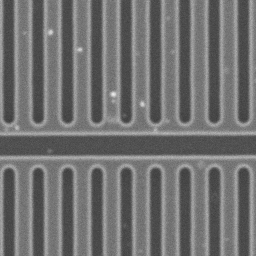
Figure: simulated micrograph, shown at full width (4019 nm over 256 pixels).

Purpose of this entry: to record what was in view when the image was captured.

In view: groups of lines, slits or small figures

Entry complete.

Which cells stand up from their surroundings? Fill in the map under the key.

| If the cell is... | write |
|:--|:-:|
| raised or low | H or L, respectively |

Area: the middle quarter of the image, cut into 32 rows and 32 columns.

LLLHHHLLLLHHHHLLLHHHHLLLLHHHHLLL
LLLHHHLLLLHHHHLLLHHHHLLLLHHHHLLL
LLLHHHLLLLHHHHLLLHHHHLLLLHHHHLLL
LLLHHHLLLLHHHHLLLHHHHLLLLHHHHLLL
LLLHHHLLLLHHHHLLLHHHHLLLLHHHHLLL
LLLHHHLLLLHHHHLLLHHHHLLLLHHHHLLL
LLLHHHLLLLHHHHLLLHHHHLLLLHHHHLLL
LLLHHHLLLLHHHHLLLHHHHLLLLHHHHLLL
LLLHHHLLLLHHHHLLLHHHHLLLLHHHHLLL
LLLHHHLLLLHHHHLLLHHHHLLLLHHHHLLL
LLLHHHLLLLHHHHLLLHHHHLLLLHHHHLLL
LLLHHHLLLLHHHHLLLHHHHLLLLHHHHLLL
LLLHHHLLLLHHHHLLLHHHHLLLLHHHHLLL
LLLHHHLLLLHHHHLLLHHHHLLLLHHHHLLL
LLHHHHHLLHHHHHLLLHHHHHLLHHHHHLLH
HHHHHHHHHHHHHHHHHHHHHHHHHHHHHHHH
HHHHHHHHHHHHHHHHHHHHHHHHHHHHHHHH
LLLLLLLLLLLLLLLLLLLLLLLLLLLLLLLL
LLLLLLLLLLLLLLLLLLLLLLLLLLLLLLLL
LLLLLLLLLLLLLLLLLLLLLLLLLLLLLLLL
LLLLLLLLLLLLLLLLLLLLLLLLLLLLLLLL
LLLLLLLLLLLLLLLLLLLLLLLLLLLLLLLL
LLLLLLLLLLLLLLLLLLLLLLLLLLLLLLLL
HHHHHHHHHHHHHHHHHHHHHHHHHHHHHHHH
HHHHHHHHHHHHHHHHHHHHHHHHHHHHHHHH
HHHHHHHHHHHHHHHHHHHHHHHHHHHHHHHH
LLHHHHHLLLHHHHLLLHHHHHLLHHHHHLLL
LLLHHHLLLLHHHHLLLHHHHLLLLHHHHLLL
LLLHHHLLLLHHHHLLLHHHHLLLLHHHHLLL
LLLHHHLLLLHHHHLLLHHHHLLLLHHHHLLL
LLLHHHLLLLHHHHLLLHHHHLLLLHHHHLLL
LLLHHHLLLLHHHHLLLHHHHLLLLHHHHLLL